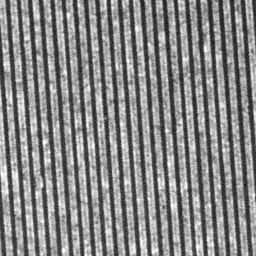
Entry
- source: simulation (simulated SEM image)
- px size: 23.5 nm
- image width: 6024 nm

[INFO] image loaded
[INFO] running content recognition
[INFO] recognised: parallel lines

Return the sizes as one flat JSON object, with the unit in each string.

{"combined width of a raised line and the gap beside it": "263 nm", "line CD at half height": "0.123 µm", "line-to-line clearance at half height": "135 nm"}